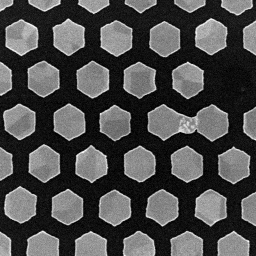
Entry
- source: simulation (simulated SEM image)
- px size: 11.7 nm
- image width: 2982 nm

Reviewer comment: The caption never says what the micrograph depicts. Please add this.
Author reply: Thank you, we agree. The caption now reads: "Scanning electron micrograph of a regular array of raised bodies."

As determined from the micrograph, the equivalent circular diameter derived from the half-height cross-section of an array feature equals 0.385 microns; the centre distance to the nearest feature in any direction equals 0.547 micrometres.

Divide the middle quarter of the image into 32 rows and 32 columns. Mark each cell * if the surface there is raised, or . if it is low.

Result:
.....****........***.........***
....*******....********.....****
...********....********....*****
...********....********....*****
....*******....********....*****
...********....********....*****
....*******....********.....****
.....****........****........***
................................
................................
**..........*...........**......
****.......****.......*****.....
*****....********....********...
*****....********....***********
*****....*******.....***********
*****....*******.....***********
*****....*******.....***********
****......******......******....
**..........**..........**......
................................
................................
.....***.........****........***
....******.....*******.....*****
...*******.....********....*****
...********....********....*****
...********....********....*****
...********....********....*****
...*******.....*******.....*****
.....****........****........***
................................
................................
........................*.......